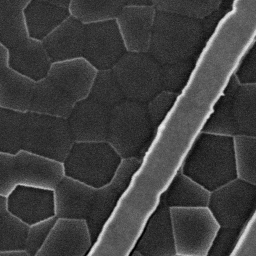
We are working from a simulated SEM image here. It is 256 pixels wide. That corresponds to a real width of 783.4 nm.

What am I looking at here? one or a few lines or trenches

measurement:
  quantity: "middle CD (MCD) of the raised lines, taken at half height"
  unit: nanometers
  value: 103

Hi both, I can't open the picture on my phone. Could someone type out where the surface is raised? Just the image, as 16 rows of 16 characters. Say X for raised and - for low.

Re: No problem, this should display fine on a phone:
---------------X
--------------XX
-------------XXX
-------------XX-
------------XXX-
------------XX--
-----------XX---
----------XXX---
----------XX----
---------XXX----
---------XX-----
--------XXX-----
--------XX------
-------XX-------
------XXX------X
------XX-------X